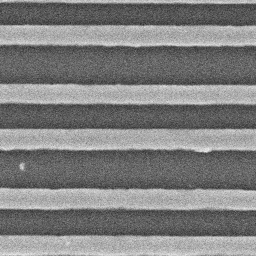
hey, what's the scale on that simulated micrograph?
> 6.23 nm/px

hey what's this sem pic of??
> lines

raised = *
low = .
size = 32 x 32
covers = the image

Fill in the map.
................................
................................
................................
********************************
********************************
********************************
................................
................................
................................
................................
................................
********************************
********************************
................................
................................
................................
********************************
********************************
********************************
................................
................................
................................
................................
................................
********************************
********************************
................................
................................
................................
................................
********************************
********************************